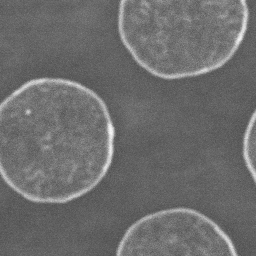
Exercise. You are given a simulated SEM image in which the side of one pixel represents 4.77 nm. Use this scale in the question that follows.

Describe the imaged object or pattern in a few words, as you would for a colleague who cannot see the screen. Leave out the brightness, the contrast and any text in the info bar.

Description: raised bodies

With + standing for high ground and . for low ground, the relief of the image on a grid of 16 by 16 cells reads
........+++++++.
.......++++++++.
........+++++++.
........++++++..
.........++++...
.++++...........
++++++..........
+++++++.........
+++++++........+
+++++++........+
+++++++.........
.+++++..........
..++............
.........++++...
........++++++..
.......++++++++.